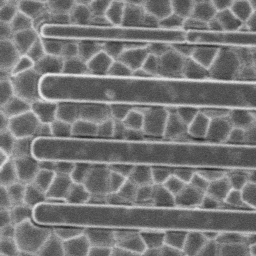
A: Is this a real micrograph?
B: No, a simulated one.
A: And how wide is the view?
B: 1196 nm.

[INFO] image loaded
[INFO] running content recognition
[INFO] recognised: one or a few lines or trenches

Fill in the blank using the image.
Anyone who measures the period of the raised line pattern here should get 61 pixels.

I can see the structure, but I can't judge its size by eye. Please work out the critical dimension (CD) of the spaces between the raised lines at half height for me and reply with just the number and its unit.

169 nm